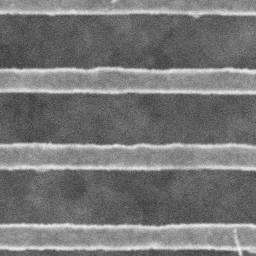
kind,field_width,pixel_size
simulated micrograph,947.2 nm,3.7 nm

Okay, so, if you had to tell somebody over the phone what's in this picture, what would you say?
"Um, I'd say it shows lines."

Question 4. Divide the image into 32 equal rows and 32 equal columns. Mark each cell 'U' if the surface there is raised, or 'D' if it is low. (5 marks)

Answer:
UUUUUUUUUUUUUUUUUUUUUUUUUUUUUUUU
UDUUUUUUUUUUUUUUUUUUUUUUUUUUUUUU
DDDDDDDDDDDDDDDDDDDDDDDDDDDDDDDD
DDDDDDDDDDDDDDDDDDDDDDDDDDDDDDDD
DDDDDDDDDDDDDDDDDDDDDDDDDDDDDDDD
DDDDDDDDDDDDDDDDDDDDDDDDDDDDDDDD
DDDDDDDDDDDDDDDDDDDDDDDDDDDDDDDD
DDDDDDDDDDDDDDDDDDDDDDDDDDDDDDDD
DDDDDDDDDDDDUDDDDDDDDDDDDDDDDDDD
UUUUUUUUUUUUUUUUUUUUUUUUUUUUUUUU
UUUUUUUUUUUUUUUUUUUUUUUUUUUUUUUU
DDDDDDDDDDDDUUUUDDUDUUUUUUUUUUUU
DDDDDDDDDDDDDDDDDDDDDDDDDDDDDDDD
DDDDDDDDDDDDDDDDDDDDDDDDDDDDDDDD
DDDDDDDDDDDDDDDDDDDDDDDDDDDDDDDD
DDDDDDDDDDDDDDDDDDDDDDDDDDDDDDDD
DDDDDDDDDDDDDDDDDDDDDDDDDDDDDDDD
DDDDDDDDDDDDDDDDDDDDDDDDDDDDDDDD
UUUUUUUUUUUUUUUUUUUUUUUUUUUUUUUU
UUUUUUUUUUUUUUUUUUUUUUUUUUUUUUUU
UUUUUUUUUUUUUUUUUUUUUUUUUUUUUUUU
DDDDDDDDDDDDDDDDDDDDDDDDDDDDDDDD
DDDDDDDDDDDDDDDDDDDDDDDDDDDDDDDD
DDDDDDDDDDDDDDDDDDDDDDDDDDDDDDDD
DDDDDDDDDDDDDDDDDDDDDDDDDDDDDDDD
DDDDDDDDDDDDDDDDDDDDDDDDDDDDDDDD
DDDDDDDDDDDDDDDDDDDDDDDDDDDDDDDD
DDDDDDDDDDDDDDDDDDDDDDDDDDDDDDDD
UUUUUUUUUUUUUUUUUUUUUUUUUUUUUUUU
UUUUUUUUUUUUUUUUUUUUUUUUUUUUUUUU
UUUUUUUUUUUUUUUUUUUUUUUUUUUUUUUU
DDDDDDDDDDDDDDDDDDDDDDDDDDDDDDDD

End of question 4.